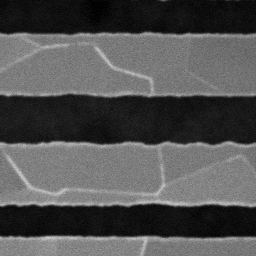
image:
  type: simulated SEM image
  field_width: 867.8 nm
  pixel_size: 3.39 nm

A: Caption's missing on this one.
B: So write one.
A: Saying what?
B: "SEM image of lines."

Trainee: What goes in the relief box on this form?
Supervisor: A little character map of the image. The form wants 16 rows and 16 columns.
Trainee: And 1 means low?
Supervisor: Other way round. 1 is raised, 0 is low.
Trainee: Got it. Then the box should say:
0000000000000000
0000000000000000
1111111111111111
1111111111111111
1111111111111111
1111111111111111
0000000000000000
0000000000000000
0000000000000000
1111111111111111
1111111111111111
1111111111111111
1111111111111111
0000000000000000
0000000000000000
1111111111111111